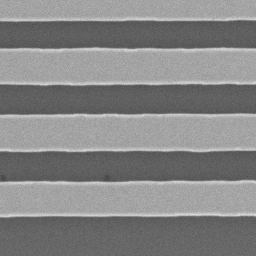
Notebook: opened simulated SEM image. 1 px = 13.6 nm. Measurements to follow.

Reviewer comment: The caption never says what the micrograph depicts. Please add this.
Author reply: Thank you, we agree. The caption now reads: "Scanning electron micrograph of wiring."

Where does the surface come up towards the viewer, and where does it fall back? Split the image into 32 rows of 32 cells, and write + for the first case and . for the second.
++++++++++++++++++++++++++++++++
++++++++++++++++++++++++++++++++
++++++++++++++++...++++++++++...
................................
................................
................................
++++++++++++++++++++++++++++++++
++++++++++++++++++++++++++++++++
++++++++++++++++++++++++++++++++
++++++++++++++++++++++++++++++++
.....+..+++.....................
................................
................................
................................
++++++++++++++++++++++++++++++++
++++++++++++++++++++++++++++++++
++++++++++++++++++++++++++++++++
++++++++++++++++++++++++++++++++
++++++++++++++++++++++++++++++++
................................
................................
................................
................................
++++++++++++++++++++++++++++++++
++++++++++++++++++++++++++++++++
++++++++++++++++++++++++++++++++
++++++++++++++++++++++++++++++++
................................
................................
................................
................................
................................